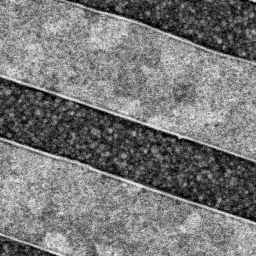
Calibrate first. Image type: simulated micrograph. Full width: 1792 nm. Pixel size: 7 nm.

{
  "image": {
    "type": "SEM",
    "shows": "one or a few lines or trenches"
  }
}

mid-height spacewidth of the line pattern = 419 nm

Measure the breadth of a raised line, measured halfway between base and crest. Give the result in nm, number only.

637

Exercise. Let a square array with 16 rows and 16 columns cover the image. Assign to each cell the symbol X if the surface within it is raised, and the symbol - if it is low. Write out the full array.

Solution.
XXXXX-----------
XXXXXXXXX-------
XXXXXXXXXXX-----
XXXXXXXXXXXXXX--
XXXXXXXXXXXXXXXX
--XXXXXXXXXXXXXX
-----XXXXXXXXXXX
--------XXXXXXXX
-----------XXXXX
XX------------XX
XXXXXX----------
XXXXXXXX--------
XXXXXXXXXXX-----
XXXXXXXXXXXXXXX-
XXXXXXXXXXXXXXXX
--XXXXXXXXXXXXXX